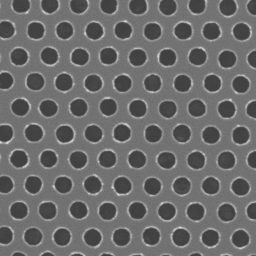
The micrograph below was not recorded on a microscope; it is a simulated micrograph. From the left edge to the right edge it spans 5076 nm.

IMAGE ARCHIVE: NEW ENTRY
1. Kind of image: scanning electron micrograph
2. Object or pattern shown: a regular array of holes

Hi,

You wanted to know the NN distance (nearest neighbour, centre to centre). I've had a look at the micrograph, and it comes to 28.9 px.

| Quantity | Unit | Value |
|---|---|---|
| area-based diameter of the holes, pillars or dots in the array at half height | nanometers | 348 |